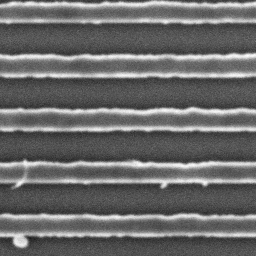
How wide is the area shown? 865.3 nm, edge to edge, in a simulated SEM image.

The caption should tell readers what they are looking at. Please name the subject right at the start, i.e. lines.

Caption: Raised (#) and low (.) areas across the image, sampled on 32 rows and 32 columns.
.##########.##############.#####
################################
################################
................................
................................
................................
................................
################################
################################
###.###############.###########.
................................
................................
................................
................................
################################
################################
................................
................................
................................
................................
.#######.#######.###.....#######
################################
################################
................................
................................
................................
................................
################################
################################
................................
................................
................................